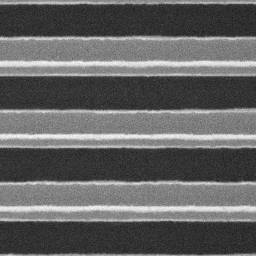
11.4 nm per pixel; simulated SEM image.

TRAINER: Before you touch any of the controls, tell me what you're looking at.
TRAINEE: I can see lines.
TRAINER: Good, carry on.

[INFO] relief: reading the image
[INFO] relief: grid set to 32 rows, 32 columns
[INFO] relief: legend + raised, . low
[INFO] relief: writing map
................................
................................
................................
................................
................................
++++++++++++++++++++++++++++++++
++++++++++++++++++++++++++++++++
++++++++++++++++++++++++++++++++
++++++++++++++++++++++++++++++++
................................
................................
................................
................................
................................
++++++++++++++++++++++++++++++++
++++++++++++++++++++++++++++++++
++++++++++++++++++++++++++++++++
++++++++++++++++++++++++++++++++
................................
................................
................................
................................
................................
++++++++++++++++++++++++++++++++
++++++++++++++++++++++++++++++++
++++++++++++++++++++++++++++++++
++++++++++++++++++++++++++++++++
++++++++++++++++++++++++++++++++
................................
................................
................................
................................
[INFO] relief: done